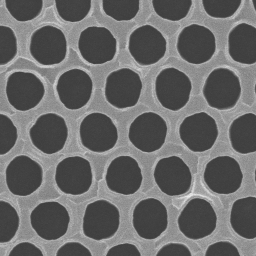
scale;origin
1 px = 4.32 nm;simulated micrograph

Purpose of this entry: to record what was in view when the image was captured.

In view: a regular array of holes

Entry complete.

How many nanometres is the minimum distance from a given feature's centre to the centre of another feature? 211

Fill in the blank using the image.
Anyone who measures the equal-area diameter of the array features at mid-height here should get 166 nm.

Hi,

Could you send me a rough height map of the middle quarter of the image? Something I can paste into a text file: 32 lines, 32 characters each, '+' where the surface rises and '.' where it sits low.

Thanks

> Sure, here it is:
++++++++++++++++++++++++++++++++
+...++++++++++...++++++++....+++
......++++++......++++++......++
.......++++........++++........+
.......++++........++++.........
.......+++..........+++.........
.......+++.........++++.........
.......+++.........++++.........
......+++++........++++........+
......+++++.......++++++.......+
.....+++++++.....++++++++.....++
+++++++++++++++++++++++++++.++++
+++++++...+++++++++....+++++++++
+++++......+++++++......++++++..
++++........+++++........+++++..
.+++.........+++..........+++...
.+++.........+++..........+++...
.+++.........+++..........+++...
.+++.........+++.........++++...
+++++........++++........+++++..
+++++........+++++......+++++++.
+++++++....++++++++....+++++++++
++++++++++++++++++++++++++++++++
.....++++++++....++++++++....+++
......++++++......+++++.......++
.......++++........++++........+
.......++++........++++........+
.......++++........+++..........
.......+++..........+++.........
.......++++.........+++.........
.......++++........+++++........
......++++++......++++++.......+